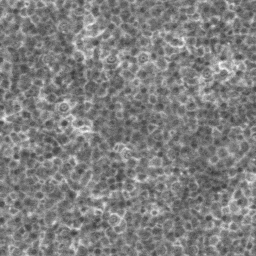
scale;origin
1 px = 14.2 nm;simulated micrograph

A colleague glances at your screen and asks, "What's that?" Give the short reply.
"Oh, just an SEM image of a regular array of raised bodies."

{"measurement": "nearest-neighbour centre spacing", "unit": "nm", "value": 115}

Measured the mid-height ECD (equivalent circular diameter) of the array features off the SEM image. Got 93.6 nm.